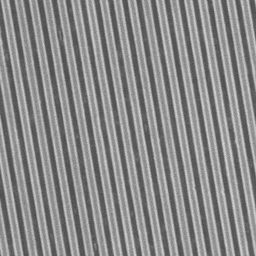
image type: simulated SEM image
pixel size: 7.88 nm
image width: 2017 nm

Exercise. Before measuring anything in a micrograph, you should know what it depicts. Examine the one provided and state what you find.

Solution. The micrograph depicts parallel lines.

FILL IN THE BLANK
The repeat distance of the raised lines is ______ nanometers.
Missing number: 110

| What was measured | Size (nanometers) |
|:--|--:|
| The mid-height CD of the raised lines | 56.4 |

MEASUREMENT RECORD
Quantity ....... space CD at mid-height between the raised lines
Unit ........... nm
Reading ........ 49.6